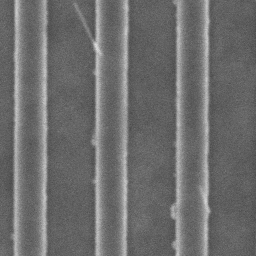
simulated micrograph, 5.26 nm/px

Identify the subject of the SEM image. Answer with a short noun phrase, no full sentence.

lines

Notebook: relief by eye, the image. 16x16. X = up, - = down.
-XX---XX---XX---
-XX---XX---XX---
-XX---XX---XX---
-XX---XX---XX---
-XX---XX---XX---
-XX---XX---XX---
-XX---XX---XX---
-XX---XX---XX---
-XX---XX---XX---
-XX---XX---XX---
-XX---XX---XX---
-XX---XX---XX---
-XX---XX---XX---
-XX---XX---XX---
-XX---XX---XX---
-XX---XX---XX---